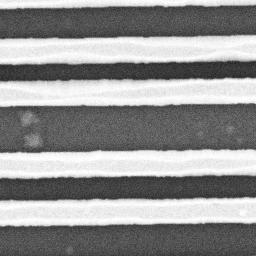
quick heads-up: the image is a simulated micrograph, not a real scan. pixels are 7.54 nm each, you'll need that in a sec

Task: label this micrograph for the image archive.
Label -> lines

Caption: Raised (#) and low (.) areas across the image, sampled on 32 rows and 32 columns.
#############..#....###.........
................................
................................
................................
................................
################################
################################
##########################......
................................
................................
####.......#####################
################################
################################
................................
................................
................................
................................
................................
................................
################################
################################
################################
................................
................................
................................
################################
################################
################################
................................
................................
................................
................................